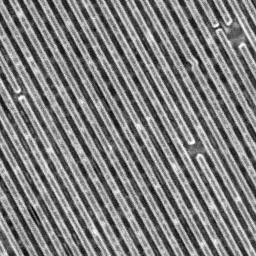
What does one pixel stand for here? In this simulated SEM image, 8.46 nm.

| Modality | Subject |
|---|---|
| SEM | parallel lines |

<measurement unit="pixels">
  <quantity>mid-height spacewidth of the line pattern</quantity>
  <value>6.82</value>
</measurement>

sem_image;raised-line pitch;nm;109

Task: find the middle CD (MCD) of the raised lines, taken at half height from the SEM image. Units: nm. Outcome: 50.2